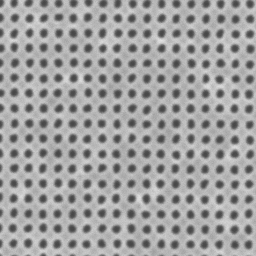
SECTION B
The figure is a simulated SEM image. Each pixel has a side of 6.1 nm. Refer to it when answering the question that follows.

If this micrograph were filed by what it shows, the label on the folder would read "a regular array of holes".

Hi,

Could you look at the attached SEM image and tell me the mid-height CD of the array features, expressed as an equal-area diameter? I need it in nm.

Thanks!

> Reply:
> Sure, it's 58.4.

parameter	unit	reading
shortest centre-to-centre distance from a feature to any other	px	14.2